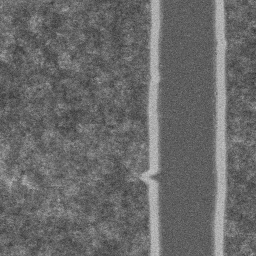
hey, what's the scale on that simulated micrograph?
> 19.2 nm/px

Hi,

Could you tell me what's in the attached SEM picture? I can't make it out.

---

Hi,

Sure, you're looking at one or a few lines or trenches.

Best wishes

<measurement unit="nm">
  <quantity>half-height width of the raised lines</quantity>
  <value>1300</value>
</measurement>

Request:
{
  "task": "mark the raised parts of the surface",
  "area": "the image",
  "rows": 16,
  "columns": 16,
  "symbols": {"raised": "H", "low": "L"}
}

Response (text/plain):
LLLLLLLLLLHHHHLL
LLLLLLLLLLHHHHLL
LLLLLLLLLLHHHHLL
LLLLLLLLLLHHHHLL
LLLLLLLLLLHHHHLL
LLLLLLLLLLHHHHLL
LLLLLLLLLLHHHHLL
LLLLLLLLLLHHHHLL
LLLLLLLLLLHHHHLL
LLLLLLLLLLHHHHLL
LLLLLLLLLHHHHHLL
LLLLLLLLLHHHHHLL
LLLLLLLLLLHHHHLL
LLLLLLLLLLHHHHLL
LLLLLLLLLLHHHHLL
LLLLLLLLLLHHHHLL